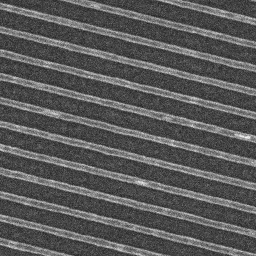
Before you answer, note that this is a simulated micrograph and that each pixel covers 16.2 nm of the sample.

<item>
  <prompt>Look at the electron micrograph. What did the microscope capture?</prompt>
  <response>parallel lines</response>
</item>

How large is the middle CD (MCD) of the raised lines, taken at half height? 94.2 nm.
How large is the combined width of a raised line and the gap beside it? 370 nm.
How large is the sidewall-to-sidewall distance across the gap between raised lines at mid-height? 277 nanometres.